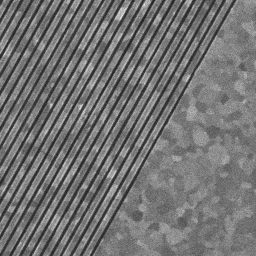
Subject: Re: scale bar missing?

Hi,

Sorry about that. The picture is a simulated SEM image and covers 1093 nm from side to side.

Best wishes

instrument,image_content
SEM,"parallel lines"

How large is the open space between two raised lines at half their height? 12.1 nanometers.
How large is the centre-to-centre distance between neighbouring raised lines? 8.83 pixels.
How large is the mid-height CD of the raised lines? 0.0242 microns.